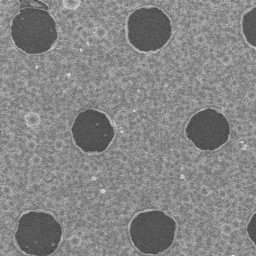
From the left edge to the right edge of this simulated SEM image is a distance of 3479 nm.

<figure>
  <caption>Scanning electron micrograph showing holes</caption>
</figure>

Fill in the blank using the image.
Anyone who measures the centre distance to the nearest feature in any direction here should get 1580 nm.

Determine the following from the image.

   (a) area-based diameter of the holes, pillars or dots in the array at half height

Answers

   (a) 0.599 microns